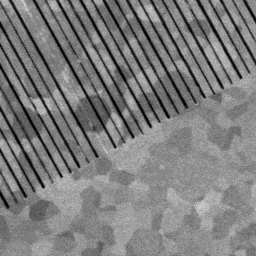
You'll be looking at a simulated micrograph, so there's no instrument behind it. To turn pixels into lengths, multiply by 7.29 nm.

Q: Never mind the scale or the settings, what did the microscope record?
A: parallel lines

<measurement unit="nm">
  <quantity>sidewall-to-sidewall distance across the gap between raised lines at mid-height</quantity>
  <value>19.1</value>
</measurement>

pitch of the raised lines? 74.4 nm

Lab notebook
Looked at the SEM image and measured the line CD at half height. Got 55.8 nanometres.